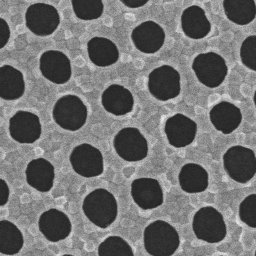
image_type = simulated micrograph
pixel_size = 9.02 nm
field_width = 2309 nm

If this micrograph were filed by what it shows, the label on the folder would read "a regular array of holes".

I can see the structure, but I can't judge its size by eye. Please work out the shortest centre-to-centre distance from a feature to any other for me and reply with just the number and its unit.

0.435 micrometres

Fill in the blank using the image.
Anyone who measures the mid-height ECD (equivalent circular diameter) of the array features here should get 0.295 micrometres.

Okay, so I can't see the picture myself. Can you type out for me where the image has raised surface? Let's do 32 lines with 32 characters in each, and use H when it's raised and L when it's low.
HHHHLLHHHLLLLHHHLLHHHHHHHHHHLLLL
HHHLLLLHHLLLLHHHHHHHHHHLLLHHLLLL
HHHLLLLHHHLHHHHHHHHHHHHLLLHHHLLL
LHHHLLLHHHHHHHHHHLLLHHHLLLHHHHHH
LHHHHHHHHHHHHHHHLLLLLHHHLLHHHHHL
LHHHHHHHHHHLLLHHHLLLHHHHHHHHHHLL
HHHHHHLLHHHLLLLHHHLHHHHHHHHHHHLL
HHHHHLLLLHHLLLLHHHHHHHHHLLLLHHLL
LLHHHLLLLHHHHHHHHHHHLLHHLLLLHHHL
LLLHHLLLLHHHHHHHHHHLLLHHHLLLHHHH
LLLHHHHHHHHHHHHHHHHLLLHHHLLLHHHH
LLLHHHHHHHHHHLLLHHHLLLHHHHHHHHHH
HHHHHHHLLLHHHLLLLHHHLHHHHHHHHHHH
HHHHHHHLLLLHHLLLHHHHHHHHHHHLLLHH
HHLLLHHLLLLHHHHHHHHHHHLHHHLLLLHH
HLLLLHHLLLHHHHHHHHHHHLLLHHHLLLHH
HLLLLHHHHHHHHHHLLHHHHLLLHHHHLHHH
HHLLLHHHHHHHHHLLLLHHHLLLHHHHHHHH
HHHHHHHHHLLLHHLLLLHHHHHHHHHHHLLH
HHHHHHHHHLLLLHHLLLHHHHHHHHHHLLLL
HHHHLLHHHLLLLHHHHHHHHHHLLHHHLLLL
HHHLLLLHHLLLLHHHHHHHHHHLLLHHLLLL
HHHLLLLHHHHHHHHHHLLHHHLLLLHHHLLH
LHHHLLHHHHHHHHHHLLLLHHHLLLHHHHHH
LHHHHHHHHHHLLLHHLLLLHHHHHHHHHHHL
LHHHHHHHHHLLLLLHHLLLHHHHHHHHHHLL
HHHHHHLLHHHLLLLHHHHHHHHHHLLHHHLL
HHHHHLLLLHHLLLHHHHHHHHHHLLLLHHLL
LLHHHLLLLHHHHHHHHHLLLLHHLLLLHHHH
LLLHHHLLHHHHHHHHHHLLLLHHLLLLHHHH
LLLHHHHHHHHHHLLLHHLLLLHHHHHHHHHH
LLHHHHHHHHHHLLLLLHLLLLHHHHHHHHHH